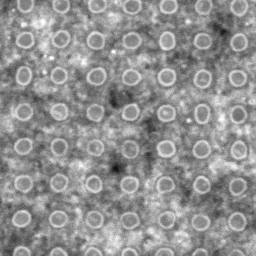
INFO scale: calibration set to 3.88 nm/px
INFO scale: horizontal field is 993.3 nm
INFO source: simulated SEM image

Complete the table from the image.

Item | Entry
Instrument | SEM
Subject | a regular array of raised bodies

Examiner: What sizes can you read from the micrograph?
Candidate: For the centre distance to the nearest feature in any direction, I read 0.135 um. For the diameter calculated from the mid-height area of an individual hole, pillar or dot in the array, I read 63.4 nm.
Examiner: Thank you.